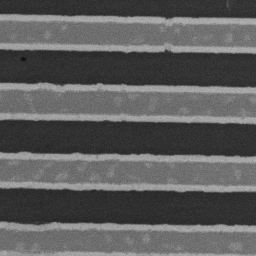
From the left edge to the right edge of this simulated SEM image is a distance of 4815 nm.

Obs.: one or a few lines or trenches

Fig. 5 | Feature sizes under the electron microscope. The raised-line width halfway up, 0.53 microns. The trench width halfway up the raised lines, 764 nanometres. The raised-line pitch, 1300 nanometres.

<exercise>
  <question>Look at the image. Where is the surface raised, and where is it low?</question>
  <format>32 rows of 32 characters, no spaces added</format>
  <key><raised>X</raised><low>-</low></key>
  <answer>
--------------------------------
--------------------------------
XXXXXXXXXXXXX-------------------
XXXXXXXXXXXXXXXXXXXXXXXXXXXXXXXX
XXXXXXXXXXXXXXXXXXXXXXXXXXXXXXXX
XXXXXXXXXXXXXXXXXXXXXXXXXXXXXXXX
--------------------------------
--------------------------------
--------------------------------
--------------------------------
--------------------------------
XXXXXXXXXXXXXXXXXXXXXXXXXXXXXXXX
XXXXXXXXXXXXXXXXXXXXXXXXXXXXXXXX
XXXXXXXXXXXXXXXXXXXXXXXXXXXXXXXX
X--XXXXXXXXXXXXXXXXXXXXXXXXXXXXX
--------------------------------
--------------------------------
--------------------------------
--------------------------------
---X----------------------------
XXXXXXXXXXXXXXXXXXXXXXXXXXXXXXXX
XXXXXXXXXXXXXXXXXXXXXXXXXXXXXXXX
XXXXXXXXXXXXXXXXXXXXXXXXXXXXXXXX
--------------------------XXXX--
--------------------------------
--------------------------------
--------------------------------
--------------------------------
XXXXXXXXXXXXXXXXXX--X-----------
XXXXXXXXXXXXXXXXXXXXXXXXXXXXXXXX
XXXXXXXXXXXXXXXXXXXXXXXXXXXXXXXX
XXXXXXXXXXXXXXXXXXXXXXXXXXXXXXXX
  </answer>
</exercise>